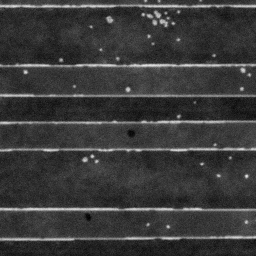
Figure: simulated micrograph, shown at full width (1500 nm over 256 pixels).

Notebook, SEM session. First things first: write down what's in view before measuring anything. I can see lines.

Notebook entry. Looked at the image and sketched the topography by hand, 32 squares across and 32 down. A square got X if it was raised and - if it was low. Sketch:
XXXXXXXXXXXXXXXXXXXXXXXXXXXXXXXX
--------------------------------
--------------------------------
--------------------------------
--------------------------------
--------------------------------
--------------------------------
--------------------------------
XXXXXXXXXXXXXXXXXXXXXXXXXXXXXXXX
XXXXXXXXXXXXXXXXXXXXXXXXXXXXXXXX
XXXXXXXXXXXXXXXXXXXXXXXXXXXXXXXX
XXXXXXXXXXXXXXXXXXXXXXXXXXXXXXXX
--------------------------------
--------------------------------
--------------------------------
XXXXXXXXXXXXXXXXXXXXXXXXXXXXXXXX
XXXXXXXXXXXXXXXXXXXXXXXXXXXXXXXX
XXXXXXXXXXXXXXXXXXXXXXXXXXXXXXXX
XXXXXXXXXXXXXXXXXXXXXXXXXXXXXXXX
--------------------------------
--------------------------------
--------------------------------
--------------------------------
--------------------------------
--------------------------------
--------------------------------
XXXXXXXXXXXXXXXXXXXXXXXXXXXXXXXX
XXXXXXXXXXXXXXXXXXXXXXXXXXXXXXXX
XXXXXXXXXXXXXXXXXXXXXXXXXXXXXXXX
XXXXXXXXXXXXXXXXXXXXXXXXXXXXXXXX
--------------------------------
--------------------------------